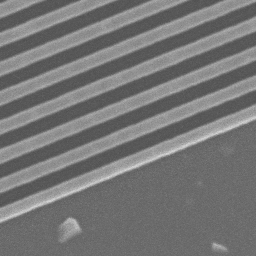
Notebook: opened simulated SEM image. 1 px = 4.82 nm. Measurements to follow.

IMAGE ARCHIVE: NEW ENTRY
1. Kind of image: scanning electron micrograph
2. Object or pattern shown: parallel lines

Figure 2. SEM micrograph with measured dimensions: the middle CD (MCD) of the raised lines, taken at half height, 56.4 nanometers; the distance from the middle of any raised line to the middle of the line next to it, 27.1 pixels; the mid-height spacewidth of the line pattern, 0.0703 micrometres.